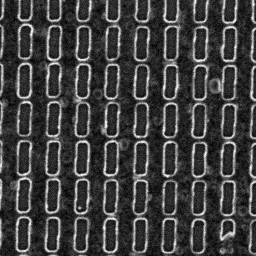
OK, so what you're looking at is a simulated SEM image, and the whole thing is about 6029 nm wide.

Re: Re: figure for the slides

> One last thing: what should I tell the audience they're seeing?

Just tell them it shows a regular array of holes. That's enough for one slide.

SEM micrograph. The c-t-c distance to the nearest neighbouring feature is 685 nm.